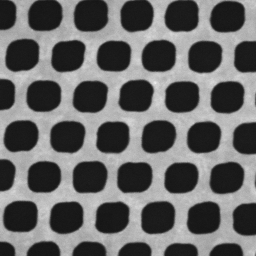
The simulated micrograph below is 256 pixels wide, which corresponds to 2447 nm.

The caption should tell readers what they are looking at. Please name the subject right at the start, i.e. a regular array of holes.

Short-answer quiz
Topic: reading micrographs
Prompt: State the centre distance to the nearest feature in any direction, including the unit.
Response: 0.436 microns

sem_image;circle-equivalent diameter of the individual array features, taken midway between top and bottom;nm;327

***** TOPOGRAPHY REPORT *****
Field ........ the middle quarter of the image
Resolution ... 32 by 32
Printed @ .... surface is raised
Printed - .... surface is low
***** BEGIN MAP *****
----@@@@@-------@@@@-------@@@@-
---@@@@@@------@@@@@@-----@@@@@@
@@@@@@@@@@@@@@@@@@@@@@@@@@@@@@@@
@@@@@@@@@@@@@@@@@@@@@@@@@@@@@@@@
@@@@@----@@@@@@@-----@@@@@@@----
@@@--------@@@--------@@@@------
@@@--------@@@--------@@@-------
@@---------@@@--------@@@-------
@@---------@@@--------@@@-------
@@---------@@@--------@@@-------
@@--------@@@@-------@@@@@------
@@@------@@@@@@------@@@@@------
@@@@@@@@@@@@@@@@@@@@@@@@@@@@@@@@
@@@@@@@@@@@@@@@@@@@@@@@@@@@@@@@@
----@@@@@@@-@-@@@@@@@@----@@@@@@
-----@@@@-------@@@@--------@@@@
-----@@@--------@@@@--------@@@-
-----@@@--------@@@---------@@@-
-----@@@--------@@@---------@@@-
-----@@@--------@@@---------@@@-
-----@@@--------@@@--------@@@@-
---@@@@@@------@@@@@------@@@@@@
@@@@@@@@@@@@@@@@@@@@@@@@@@@@@@@@
@@@@@@@@@@@@@@@@@@@@@@@@@@@@@@@@
@@@@-----@@@@@@@@@@@@@@@@@@@@@@@
@@@-------@@@@--------@@@@@-----
@@---------@@@--------@@@@------
@@---------@@---------@@@-------
@@---------@@---------@@@-------
@@---------@@---------@@@-------
@@--------@@@--------@@@@-------
@@@------@@@@@-------@@@@@------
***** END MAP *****